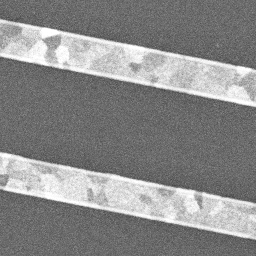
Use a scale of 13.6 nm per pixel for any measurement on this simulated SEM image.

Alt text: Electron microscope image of one or a few lines or trenches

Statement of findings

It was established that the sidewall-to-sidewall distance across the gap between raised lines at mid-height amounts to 1330 nanometres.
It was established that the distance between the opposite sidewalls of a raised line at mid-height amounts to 436 nm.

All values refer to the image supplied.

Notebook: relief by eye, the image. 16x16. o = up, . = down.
................
o...............
oooooo..........
.oooooooooo.....
......oooooooooo
...........ooooo
................
................
................
................
oooo............
ooooooooo.......
....oooooooooo..
.........ooooooo
..............oo
................